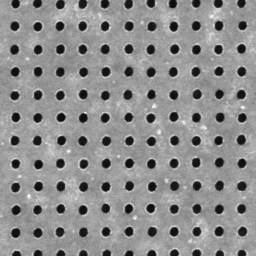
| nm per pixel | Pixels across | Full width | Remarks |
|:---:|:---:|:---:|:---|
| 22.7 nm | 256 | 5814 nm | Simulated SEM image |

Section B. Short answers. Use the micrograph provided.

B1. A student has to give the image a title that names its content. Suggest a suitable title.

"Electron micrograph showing a regular array of holes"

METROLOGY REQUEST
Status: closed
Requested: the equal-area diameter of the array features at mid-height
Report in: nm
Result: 217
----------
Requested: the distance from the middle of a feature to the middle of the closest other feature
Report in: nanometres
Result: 501